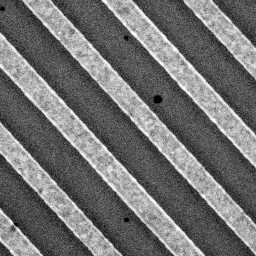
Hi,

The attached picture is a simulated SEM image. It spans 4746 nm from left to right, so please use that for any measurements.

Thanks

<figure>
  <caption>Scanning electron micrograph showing lines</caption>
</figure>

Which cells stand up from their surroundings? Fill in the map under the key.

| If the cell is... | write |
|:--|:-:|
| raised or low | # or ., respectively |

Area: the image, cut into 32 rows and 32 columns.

...####......####......####.....
....####......####......####....
.....###.......####......####...
......###.......####......####..
.......###.......####......###..
#.......###.......###.......###.
##.......###.......###.......###
###.......###.......###.......##
####.......###.......###.......#
.####......####......####.......
..####......####......####......
...####......####......####.....
....####......####......####....
.....####......####......####...
......###.......###.......####..
.......###.......###.......####.
#.......###.......###.......####
##.......###.......###.......###
###.......###.......###.......##
####......####.......###.......#
.####......####.......###.......
..####......####......####......
...####......####......####.....
....###.......####......####....
.....###.......####......####...
......###.......####......####..
.......###.......####......###..
#.......###.......###.......###.
##.......###.......###.......###
###.......###.......###.......##
####.......###.......###.......#
.####......####......####.......